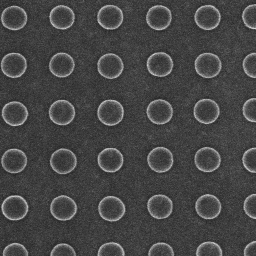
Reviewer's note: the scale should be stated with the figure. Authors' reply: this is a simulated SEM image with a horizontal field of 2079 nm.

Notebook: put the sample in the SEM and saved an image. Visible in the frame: a regular array of raised bodies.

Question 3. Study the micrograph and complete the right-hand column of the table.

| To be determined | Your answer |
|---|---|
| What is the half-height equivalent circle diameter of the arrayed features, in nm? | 203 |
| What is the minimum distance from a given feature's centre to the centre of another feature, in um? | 0.382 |